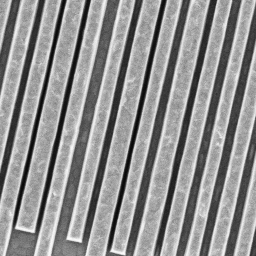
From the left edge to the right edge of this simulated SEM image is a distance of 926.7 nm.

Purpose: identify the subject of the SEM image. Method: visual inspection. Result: parallel lines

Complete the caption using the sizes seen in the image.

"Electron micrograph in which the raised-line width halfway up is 54.8 nanometers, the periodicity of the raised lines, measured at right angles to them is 86.4 nanometers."